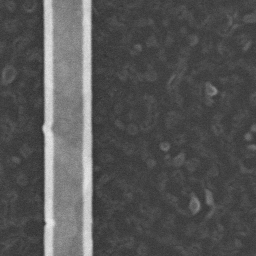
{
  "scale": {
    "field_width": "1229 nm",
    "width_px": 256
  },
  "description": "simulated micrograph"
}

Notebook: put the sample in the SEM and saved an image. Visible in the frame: one or a few lines or trenches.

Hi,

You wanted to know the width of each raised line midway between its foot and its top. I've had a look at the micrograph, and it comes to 187 nm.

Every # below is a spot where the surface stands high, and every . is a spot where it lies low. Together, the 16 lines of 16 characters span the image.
...##...........
...##...........
...##...........
...##...........
...##...........
...##...........
...##...........
...##...........
...##...........
...##...........
...##...........
...##...........
...##...........
...##...........
...##...........
...###..........